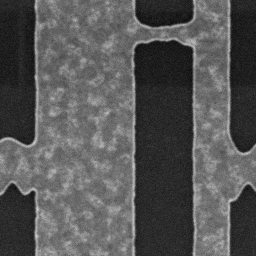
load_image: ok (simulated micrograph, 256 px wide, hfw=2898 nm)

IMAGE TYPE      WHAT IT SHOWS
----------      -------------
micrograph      one or a few lines or trenches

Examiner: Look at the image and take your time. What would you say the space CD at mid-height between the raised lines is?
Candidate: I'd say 0.676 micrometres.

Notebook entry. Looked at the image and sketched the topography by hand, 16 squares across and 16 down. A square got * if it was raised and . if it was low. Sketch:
..******....**..
..*******..***..
..********.***..
..******....**..
..******....**..
..******....**..
..******....**..
..******....**..
..******....**..
********....****
********....****
********....****
..******....***.
..******....**..
..******....**..
..******....**..